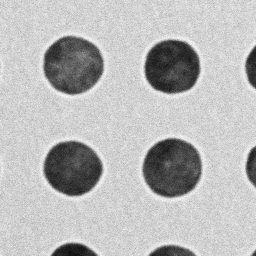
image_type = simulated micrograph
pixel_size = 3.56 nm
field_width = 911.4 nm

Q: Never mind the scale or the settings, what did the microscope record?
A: holes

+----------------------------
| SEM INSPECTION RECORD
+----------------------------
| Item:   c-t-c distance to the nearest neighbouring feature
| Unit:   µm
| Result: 0.354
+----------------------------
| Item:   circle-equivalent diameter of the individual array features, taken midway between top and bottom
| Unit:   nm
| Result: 207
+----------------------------